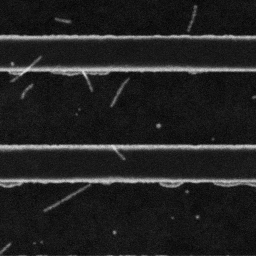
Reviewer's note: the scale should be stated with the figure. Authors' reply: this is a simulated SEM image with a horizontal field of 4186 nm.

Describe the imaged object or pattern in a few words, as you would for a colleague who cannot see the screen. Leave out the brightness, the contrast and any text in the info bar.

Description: lines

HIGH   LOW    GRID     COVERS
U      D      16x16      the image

DDDDDDDDDDDDDDDD
DDDDDDDDDDDDDDDD
UUUUUUUUUUUUUUUU
UUUUUUUUUUUUUUUU
DDDDDDDDDDDDDDDD
DDDDDDDDDDDDDDDD
DDDDDDDDDDDDDDDD
DDDDDDDDDDDDDDDD
DDDDDDDDDDDDDDDD
UUUUUUUUUUUUUUUU
UUUUUUUUUUUUUUUU
DDDDDDDDDDDDDDDD
DDDDDDDDDDDDDDDD
DDDDDDDDDDDDDDDD
DDDDDDDDDDDDDDDD
DDDDDDDDDDDDDDDD